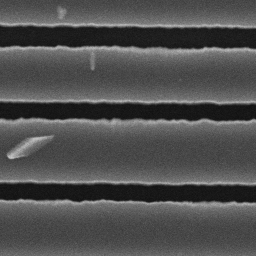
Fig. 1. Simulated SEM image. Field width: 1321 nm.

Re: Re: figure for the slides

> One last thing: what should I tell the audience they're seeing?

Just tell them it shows lines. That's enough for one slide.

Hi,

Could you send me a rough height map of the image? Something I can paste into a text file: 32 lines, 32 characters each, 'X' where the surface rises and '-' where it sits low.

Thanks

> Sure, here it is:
XXXXXXXXXXXXXXXXXXXXXXXXXXXXXXXX
XXXXXXXXXXXXXXXXXXXXXXXXXXXXXXXX
XXXXXXXXXXXXXXXXXXXXXXXXXXXXXXXX
--------------------------------
--------------------------------
--------------------------------
XXXXXXXXXXXXXXXXXXXXXXXXXXXXXXXX
XXXXXXXXXXXXXXXXXXXXXXXXXXXXXXXX
XXXXXXXXXXXXXXXXXXXXXXXXXXXXXXXX
XXXXXXXXXXXXXXXXXXXXXXXXXXXXXXXX
XXXXXXXXXXXXXXXXXXXXXXXXXXXXXXXX
XXXXXXXXXXXXXXXXXXXXXXXXXXXXXXXX
XXXXXXXXXXXXXXXXXXXXXXXXXXXXXXXX
--------------------------------
--------------------------------
XXXXXXXXXXXXXXXXXXXXXXXXXXXXXXXX
XXXXXXXXXXXXXXXXXXXXXXXXXXXXXXXX
XXXXXXXXXXXXXXXXXXXXXXXXXXXXXXXX
XXXXXXXXXXXXXXXXXXXXXXXXXXXXXXXX
XXXXXXXXXXXXXXXXXXXXXXXXXXXXXXXX
XXXXXXXXXXXXXXXXXXXXXXXXXXXXXXXX
XXXXXXXXXXXXXXXXXXXXXXXXXXXXXXXX
XXXXXXXXXXXXXXXXXXXXXXXXXXXXXXXX
--------------------------------
--------------------------------
XXXXXXXXXXXXXXXXXXXXXXXXXXXXXXXX
XXXXXXXXXXXXXXXXXXXXXXXXXXXXXXXX
XXXXXXXXXXXXXXXXXXXXXXXXXXXXXXXX
XXXXXXXXXXXXXXXXXXXXXXXXXXXXXXXX
XXXXXXXXXXXXXXXXXXXXXXXXXXXXXXXX
XXXXXXXXXXXXXXXXXXXXXXXXXXXXXXXX
XXXXXXXXXXXXXXXXXXXXXXXXXXXXXXXX